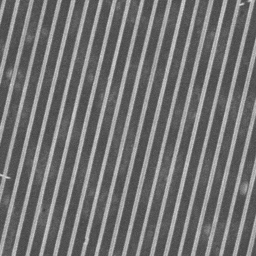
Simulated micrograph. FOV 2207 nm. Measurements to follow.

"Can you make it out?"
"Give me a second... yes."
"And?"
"parallel lines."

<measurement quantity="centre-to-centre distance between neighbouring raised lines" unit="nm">116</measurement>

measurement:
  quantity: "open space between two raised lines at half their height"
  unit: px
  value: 10.3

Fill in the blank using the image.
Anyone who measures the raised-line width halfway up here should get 25.1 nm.